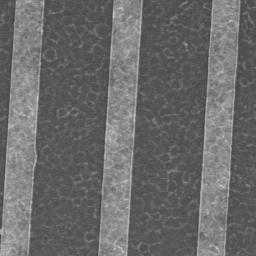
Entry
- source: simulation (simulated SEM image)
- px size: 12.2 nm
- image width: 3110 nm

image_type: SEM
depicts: one or a few lines or trenches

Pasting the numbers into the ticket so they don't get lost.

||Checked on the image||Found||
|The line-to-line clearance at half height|859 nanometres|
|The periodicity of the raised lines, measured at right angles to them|1190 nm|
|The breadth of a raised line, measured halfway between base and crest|332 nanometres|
